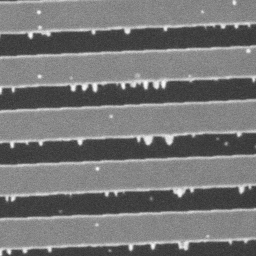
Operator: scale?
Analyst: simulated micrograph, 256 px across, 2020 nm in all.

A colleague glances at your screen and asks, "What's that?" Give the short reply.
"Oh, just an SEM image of lines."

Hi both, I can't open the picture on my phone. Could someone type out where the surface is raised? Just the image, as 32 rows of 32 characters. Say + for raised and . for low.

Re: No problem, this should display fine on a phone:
++++++++++++++++++++++++++++++++
++++++++++++++++++++++++++++++++
++++++++++++++++++++++++++++++++
+++++++++++++++++...+...........
................................
................................
...............+++++++++++++++++
++++++++++++++++++++++++++++++++
++++++++++++++++++++++++++++++++
++++++++++++++++++++++++++++++++
+++++++++++++..++.+++...........
................................
..............................++
..........++++++++++++++++++++++
++++++++++++++++++++++++++++++++
++++++++++++++++++++++++++++++++
++++++++++++++++++++++++++++++++
+++++++++++.......+..+..........
................................
.............................+++
....++++++++++++++++++++++++++++
++++++++++++++++++++++++++++++++
++++++++++++++++++++++++++++++++
+++++++++++++++++++++++++.....+.
++..............................
................................
.......................+++++++++
++++++++++++++++++++++++++++++++
++++++++++++++++++++++++++++++++
++++++++++++++++++++++++++++++++
++++++++++++++++++++..++........
................................